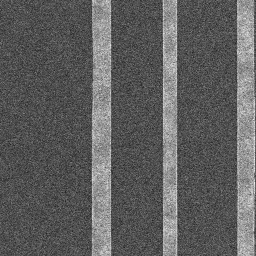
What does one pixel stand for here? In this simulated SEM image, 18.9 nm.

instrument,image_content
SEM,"one or a few lines or trenches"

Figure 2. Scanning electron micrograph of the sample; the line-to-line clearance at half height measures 1080 nanometers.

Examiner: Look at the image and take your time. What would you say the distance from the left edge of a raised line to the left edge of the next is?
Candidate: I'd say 1.36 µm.